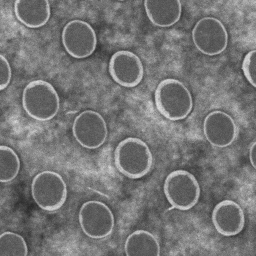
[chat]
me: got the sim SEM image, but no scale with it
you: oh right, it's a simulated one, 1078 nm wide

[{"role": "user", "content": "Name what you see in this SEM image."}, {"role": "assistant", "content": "a regular array of raised bodies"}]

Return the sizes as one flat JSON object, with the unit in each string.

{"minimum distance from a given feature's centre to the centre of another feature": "231 nm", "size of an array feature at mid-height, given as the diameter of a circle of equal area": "149 nm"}